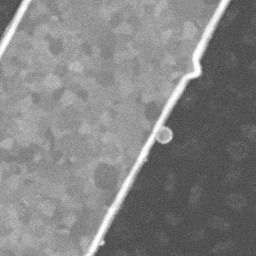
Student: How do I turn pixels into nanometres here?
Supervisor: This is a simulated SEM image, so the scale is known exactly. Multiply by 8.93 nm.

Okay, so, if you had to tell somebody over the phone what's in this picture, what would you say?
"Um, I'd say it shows one or a few lines or trenches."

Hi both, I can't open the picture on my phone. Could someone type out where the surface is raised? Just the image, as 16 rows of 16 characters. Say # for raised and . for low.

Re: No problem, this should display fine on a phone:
.#############..
.############...
#############...
############....
############....
###########.....
###########.....
##########......
##########......
#########.......
########........
########........
#######.........
#######.........
######..........
######..........